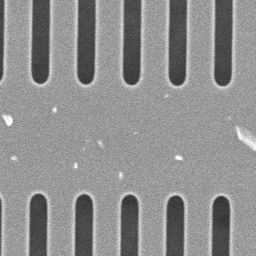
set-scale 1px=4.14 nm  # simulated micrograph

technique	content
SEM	groups of lines, slits or small figures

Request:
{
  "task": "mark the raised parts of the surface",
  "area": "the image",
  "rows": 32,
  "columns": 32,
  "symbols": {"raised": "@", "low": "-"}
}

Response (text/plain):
-@@@--@@@@--@@@---@@@--@@@@--@@@
-@@@--@@@@--@@@---@@@--@@@@--@@@
-@@@--@@@@--@@@---@@@--@@@@--@@@
-@@@--@@@@--@@@---@@@--@@@@--@@@
-@@@--@@@@--@@@---@@@--@@@@--@@@
@@@@--@@@@--@@@---@@@--@@@@--@@@
@@@@--@@@@--@@@---@@@--@@@@--@@@
@@@@--@@@@--@@@---@@@--@@@@--@@@
@@@@--@@@@--@@@---@@@--@@@@--@@@
@@@@--@@@@--@@@---@@@--@@@@--@@@
@@@@@@@@@@-@@@@@-@@@@@-@@@@-@@@@
@@@@@@@@@@@@@@@@@@@@@@@@@@@@@@@@
@@@@@@@@@@@@@@@@@@@@@@@@@@@@@@@@
@@@@@@@@@@@@@@@@@@@@@@@@@@@@@@@@
@@@@@@@@@@@@@@@@@@@@@@@@@@@@@@@@
@@@@@@@@@@@@@@@@@@@@@@@@@@@@@@@@
@@@@@@@@@@@@@@@@@@@@@@@@@@@@@@@@
@@@@@@@@@@@@@@@@@@@@@@@@@@@@@@@@
@@@@@@@@@@@@@@@@@@@@@@@@@@@@@@@@
@@@@@@@@@@@@@@@@@@@@@@@@@@@@@@@@
@@@@@@@@@@@@@@@@@@@@@@@@@@@@@@@@
@@@@@@@@@@@@@@@@@@@@@@@@@@@@@@@@
@@@@@@@@@@@@@@@@@@@@@@@@@@@@@@@@
@@@@@@@@@@@@@@@@@@@@@@@@@@@@@@@@
@@@@-@@@@@-@@@@@-@@@@@@@@@@@@@@@
@@@@--@@@---@@@--@@@@--@@@@--@@@
@@@@--@@@---@@@--@@@@--@@@---@@@
@@@@--@@@---@@@--@@@@--@@@---@@@
@@@@--@@@---@@@--@@@@--@@@---@@@
@@@@--@@@---@@@--@@@@--@@@---@@@
@@@@--@@@---@@@--@@@@--@@@---@@@
@@@@--@@@---@@@--@@@@--@@@---@@@